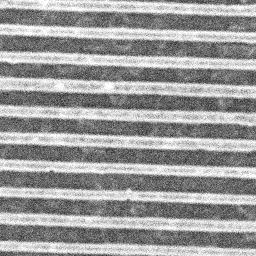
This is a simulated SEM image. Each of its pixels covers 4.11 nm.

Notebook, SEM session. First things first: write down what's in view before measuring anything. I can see parallel lines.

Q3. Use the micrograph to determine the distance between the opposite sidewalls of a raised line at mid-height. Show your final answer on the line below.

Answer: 36.9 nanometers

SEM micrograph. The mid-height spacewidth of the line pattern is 0.0749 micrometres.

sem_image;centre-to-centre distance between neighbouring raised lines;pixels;26.9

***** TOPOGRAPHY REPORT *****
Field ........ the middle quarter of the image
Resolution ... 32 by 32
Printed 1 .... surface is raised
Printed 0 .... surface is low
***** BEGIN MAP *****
00000000000000000000111111011111
00000000000000000000000000000000
00000000000000000000000000000000
00000000000000000000000000000000
11111111110000000000000000000000
11111111111111111111111111111111
11111111111111111111111111111111
00000000000000000000000001111111
00000000000000000000000000000000
00000000000000000000000000000000
00000000000000000000000000000000
11111111000000000000000000000000
11111111111111111111111111111111
00000011111111111111111111111111
00000000000000000000000000000000
00000000000000000000000000000000
00000000000000000000000000000000
00000000000000000000000000000000
11111111111111111111000000000000
11111111111111111111111111111111
00000000000111111111111111111111
00000000000000000000000000000000
00000000000000000000000000000000
00000000000000000000000000000000
00000000000000000000000000000000
11111111111111111111111110000000
11111111111111111111111111111111
00000000000000000000000000000011
00000000000000000000000000000000
00000000000000000000000000000000
00000000000000000000000000000000
00000000000000000000000000000000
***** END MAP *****